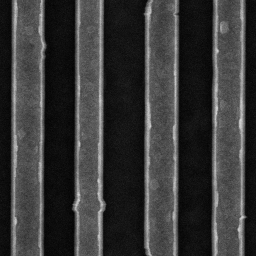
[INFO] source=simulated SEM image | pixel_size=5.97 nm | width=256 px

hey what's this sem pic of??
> one or a few lines or trenches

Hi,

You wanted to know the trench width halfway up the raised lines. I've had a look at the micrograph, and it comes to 218 nm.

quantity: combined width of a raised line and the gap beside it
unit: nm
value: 400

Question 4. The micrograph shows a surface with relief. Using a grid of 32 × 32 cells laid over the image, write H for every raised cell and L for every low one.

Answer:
LLHHHLLLLLHHHLLLLLLHHHLLLLLHHHLL
LLHHHLLLLLHHHLLLLLHHHHLLLLLHHHLL
LLHHHLLLLLHHHLLLLLHHHHLLLLLHHHLL
LLHHHLLLLLHHHLLLLLHHHHLLLLLHHHLL
LLHHHLLLLLHHHLLLLLHHHHLLLLLHHHLL
LLHHHHLLLLHHHLLLLLHHHHLLLLLHHHLL
LLHHHLLLLLHHHLLLLLHHHHLLLLLHHHLL
LLHHHLLLLLHHHLLLLLHHHHLLLLLHHHLL
LLHHHLLLLLHHHLLLLLHHHHLLLLLHHHLL
LLHHHLLLLLHHHLLLLLHHHHLLLLLHHHLL
LLHHHLLLLLHHHLLLLLHHHHLLLLLHHHLL
LLHHHLLLLLHHHLLLLLHHHHLLLLLHHHLL
LLHHHLLLLLHHHLLLLLHHHHLLLLLHHHLL
LLHHHLLLLLHHHLLLLLHHHHLLLLLHHHLL
LLHHHLLLLLHHHLLLLLHHHHLLLLLHHHLL
LLHHHLLLLLHHHLLLLLHHHHLLLLLHHHLL
LLHHHLLLLLHHHLLLLLHHHHLLLLLHHHLL
LLHHHLLLLLHHHLLLLLHHHHLLLLLHHHLL
LLHHHLLLLLHHHLLLLLHHHHLLLLLHHHLL
LLHHHLLLLLHHHLLLLLHHHHLLLLLHHHLL
LLHHHLLLLLHHHLLLLLHHHHLLLLLHHHLL
LLHHHLLLLLHHHLLLLLHHHHLLLLLHHHLL
LLHHHLLLLLHHHLLLLLHHHHLLLLLHHHLL
LLHHHLLLLLHHHLLLLLHHHHLLLLLHHHLL
LLHHHLLLLLHHHLLLLLHHHHLLLLLHHHLL
LLHHHLLLLHHHHLLLLLHHHHLLLLLHHHLL
LLHHHLLLLHHHHLLLLLHHHHLLLLLHHHLL
LLHHHLLLLLHHHLLLLLHHHHLLLLLHHHLL
LLHHHLLLLLHHHLLLLLHHHHLLLLLHHHLL
LLHHHLLLLLHHHLLLLLHHHHLLLLLHHHLL
LLHHHLLLLLHHHLLLLLHHHHLLLLLHHHLL
LLHHHLLLLLHHHLLLLLHHHHLLLLLHHHLL